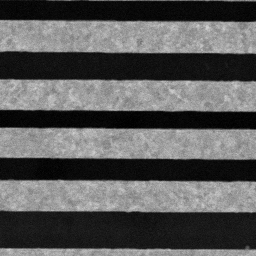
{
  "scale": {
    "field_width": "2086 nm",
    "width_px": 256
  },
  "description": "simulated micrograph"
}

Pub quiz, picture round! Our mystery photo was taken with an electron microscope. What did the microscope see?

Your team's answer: lines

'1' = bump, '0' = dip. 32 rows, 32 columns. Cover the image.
00000000000000000000000000000000
00000000000000000000000000000000
00000000000000000000000000000000
11111111111111111111111111111111
11111111111111111111111111111111
11111111111111111111111111111111
00000000000001111111111111111111
00000000000000000000000000000000
00000000000000000000000000000000
00000000000000000000000000000000
11111111111111111111111111111111
11111111111111111111111111111111
11111111111111111111111111111111
11111111111111111111111111111111
00000000000000000000000000000000
00000000000000000000000000000000
11111111111111111111111111111111
11111111111111111111111111111111
11111111111111111111111111111111
11111111111111111111111111111111
00000000000000000000000000000000
00000000000000000000000000000000
00000000000000000000000000000000
11111111111111111111111111111111
11111111111111111111111111111111
11111111111111111111111111111111
00000000000000000000000000000000
00000000000000000000000000000000
00000000000000000000000000000000
00000000000000000000000000000000
00000000000000000000000000000000
11111111111111111111111111111111